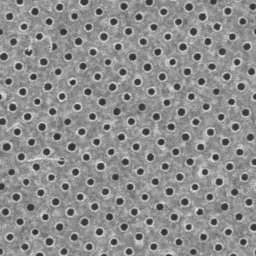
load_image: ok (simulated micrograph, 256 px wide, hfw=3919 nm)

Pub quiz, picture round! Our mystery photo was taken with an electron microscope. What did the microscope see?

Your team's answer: a regular array of holes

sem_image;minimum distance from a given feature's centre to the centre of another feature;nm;269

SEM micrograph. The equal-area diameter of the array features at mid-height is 120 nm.